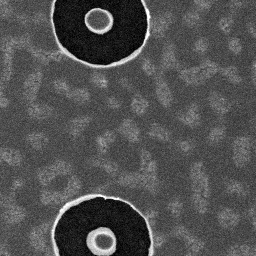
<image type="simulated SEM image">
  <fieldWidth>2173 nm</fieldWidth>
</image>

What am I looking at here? ring-shaped grooves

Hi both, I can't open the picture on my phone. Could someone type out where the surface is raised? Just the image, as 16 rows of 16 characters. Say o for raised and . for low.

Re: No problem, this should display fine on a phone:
ooo......ooooooo
ooo..oo..ooooooo
oooo.....ooooooo
oooo....oooooooo
oooooooooooooooo
oooooooooooooooo
oooooooooooooooo
oooooooooooooooo
oooooooooooooooo
oooooooooooooooo
oooooooooooooooo
oooooooooooooooo
ooooo..ooooooooo
oooo.....ooooooo
ooo...o..ooooooo
oooo..o..ooooooo